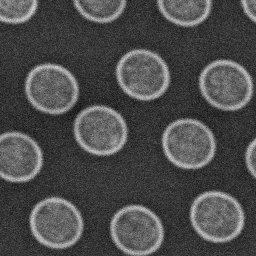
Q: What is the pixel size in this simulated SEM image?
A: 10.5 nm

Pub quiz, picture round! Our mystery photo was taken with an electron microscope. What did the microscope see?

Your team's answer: a regular array of raised bodies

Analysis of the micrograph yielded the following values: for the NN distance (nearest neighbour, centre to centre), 730 nm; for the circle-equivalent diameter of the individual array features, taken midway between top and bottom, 495 nm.